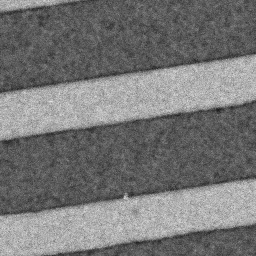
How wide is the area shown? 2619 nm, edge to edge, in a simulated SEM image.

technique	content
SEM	one or a few lines or trenches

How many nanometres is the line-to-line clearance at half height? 786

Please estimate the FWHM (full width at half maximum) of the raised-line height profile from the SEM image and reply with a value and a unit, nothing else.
450 nanometres